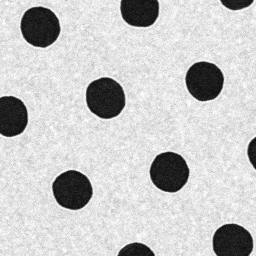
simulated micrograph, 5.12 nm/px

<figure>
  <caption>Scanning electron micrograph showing holes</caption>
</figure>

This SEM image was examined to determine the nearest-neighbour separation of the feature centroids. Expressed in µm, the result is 0.499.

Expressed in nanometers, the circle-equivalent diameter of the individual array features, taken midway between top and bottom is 206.